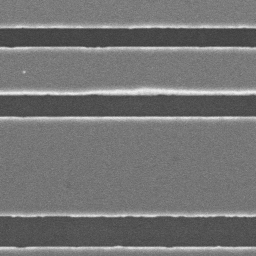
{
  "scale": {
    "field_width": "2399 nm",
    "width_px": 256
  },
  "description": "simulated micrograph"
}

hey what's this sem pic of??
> lines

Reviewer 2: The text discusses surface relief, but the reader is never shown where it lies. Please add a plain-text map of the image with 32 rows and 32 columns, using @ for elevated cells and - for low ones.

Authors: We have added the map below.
@@@@@@@@@@@@@@@@@@@@@@@@@@@@@@@@
@@@@@@@@@@@@@@@@@@@@@@@@@@@@@@@@
@@@@@@@@@@@@@@@@@@@@@@@@@@@@@@@@
----------------@---------------
--------------------------------
--------------------------------
@@@@@@@@@@@@@@@@@@@@@@@@@@@@@@@@
@@@@@@@@@@@@@@@@@@@@@@@@@@@@@@@@
@@@@@@@@@@@@@@@@@@@@@@@@@@@@@@@@
@@@@@@@@@@@@@@@@@@@@@@@@@@@@@@@@
@@@@@@@@@@@@@@@@@@@@@@@@@@@@@@@@
@@@@@@@@@@@@@@@@@@@@@@@@@@@@@@@@
--------------------------------
--------------------------------
--------------------------------
@@@@@@@@@@@@@@@@@@@@@@@@@@@@@@@@
@@@@@@@@@@@@@@@@@@@@@@@@@@@@@@@@
@@@@@@@@@@@@@@@@@@@@@@@@@@@@@@@@
@@@@@@@@@@@@@@@@@@@@@@@@@@@@@@@@
@@@@@@@@@@@@@@@@@@@@@@@@@@@@@@@@
@@@@@@@@@@@@@@@@@@@@@@@@@@@@@@@@
@@@@@@@@@@@@@@@@@@@@@@@@@@@@@@@@
@@@@@@@@@@@@@@@@@@@@@@@@@@@@@@@@
@@@@@@@@@@@@@@@@@@@@@@@@@@@@@@@@
@@@@@@@@@@@@@@@@@@@@@@@@@@@@@@@@
@@@@@@@@@@@@@@@@@@@@@@@@@@@@@@@@
@@@@@@@@@@@@@@@@@@@@@@@@@@@@@@@@
--------------------------------
--------------------------------
--------------------------------
--------------------------------
@@@@@@@@@@@@@@@@@@@@@@@@@@@@@@@@